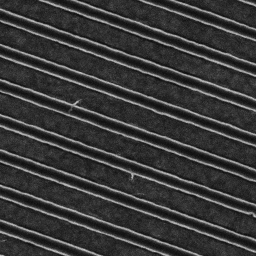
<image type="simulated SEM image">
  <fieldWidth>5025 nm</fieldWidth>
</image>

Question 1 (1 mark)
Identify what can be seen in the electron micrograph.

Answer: parallel lines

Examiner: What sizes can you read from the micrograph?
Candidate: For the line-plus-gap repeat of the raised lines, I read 651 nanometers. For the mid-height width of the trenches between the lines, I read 435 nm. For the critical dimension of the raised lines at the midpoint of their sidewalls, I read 11.6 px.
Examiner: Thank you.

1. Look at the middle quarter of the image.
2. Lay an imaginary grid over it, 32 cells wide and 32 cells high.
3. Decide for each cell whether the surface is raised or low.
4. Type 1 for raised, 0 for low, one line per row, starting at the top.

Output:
00000000000000001111111100000000
11000000000000000011111111100000
11111000000000000000011111111100
11111111000000000000000011111111
00111111111000000000000000001111
00000111111111000000000000000011
00000000111111110000000000000000
00000000000111111110000000000000
00000000000001111111110000000000
00000000000000001111111110000000
11100000000000000001111111110000
11111100000000000000001111111110
11111111100000000000000001111111
00011111111100000000000000001111
00000011111111000000000000000011
00000000011111111000000000000000
00000000000111111111000000000000
00000000000000111111111000000000
00000000000000000111111111000000
11110000000000000000111111111000
11111100000000000000000111111110
01111111100000000000000000111111
00001111111100000000000000001111
00000001111111100000000000000001
00000000011111111100000000000000
00000000000011111111000000000000
00000000000000011111111000000000
10000000000000000111111111000000
11110000000000000000011111111000
11111110000000000000000111111111
01111111110000000000000000111111
00001111111110000000000000000111